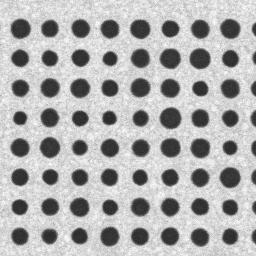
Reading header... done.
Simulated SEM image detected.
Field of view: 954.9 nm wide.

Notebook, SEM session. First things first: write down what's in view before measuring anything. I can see a regular array of holes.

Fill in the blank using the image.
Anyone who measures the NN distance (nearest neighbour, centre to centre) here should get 110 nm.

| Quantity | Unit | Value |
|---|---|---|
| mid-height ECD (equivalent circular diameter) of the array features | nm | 60.9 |